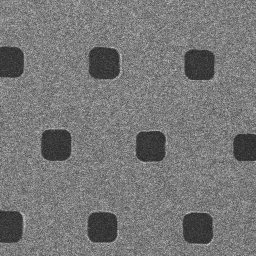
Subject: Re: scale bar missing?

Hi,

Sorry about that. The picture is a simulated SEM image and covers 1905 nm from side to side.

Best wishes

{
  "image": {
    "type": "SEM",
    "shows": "holes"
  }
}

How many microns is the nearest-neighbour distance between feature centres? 0.704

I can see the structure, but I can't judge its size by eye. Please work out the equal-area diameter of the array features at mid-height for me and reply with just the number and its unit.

246 nm